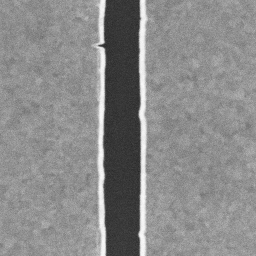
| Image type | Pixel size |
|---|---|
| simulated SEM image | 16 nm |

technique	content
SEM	one or a few lines or trenches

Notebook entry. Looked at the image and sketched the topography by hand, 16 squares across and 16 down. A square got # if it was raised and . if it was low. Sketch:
######...#######
######...#######
######...#######
######...#######
######...#######
######...#######
######...#######
######...#######
######...#######
######...#######
######...#######
######...#######
######...#######
######...#######
######...#######
######...#######